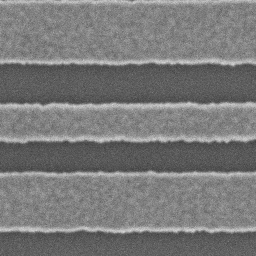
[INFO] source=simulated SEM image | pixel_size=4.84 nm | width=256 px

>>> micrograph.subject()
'lines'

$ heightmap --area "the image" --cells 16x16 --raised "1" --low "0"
1111111111111111
1111111111111111
1111111111111111
1111111111111111
0000000000000000
0000000000000000
0000000100110111
1111111111111111
1111111111111111
0000000000000000
0000000000000000
1111111111111111
1111111111111111
1111111111111111
0000000100000000
0000000000000000